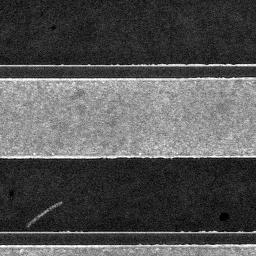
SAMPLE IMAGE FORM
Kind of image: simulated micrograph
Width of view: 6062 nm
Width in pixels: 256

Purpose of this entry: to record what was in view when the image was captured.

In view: lines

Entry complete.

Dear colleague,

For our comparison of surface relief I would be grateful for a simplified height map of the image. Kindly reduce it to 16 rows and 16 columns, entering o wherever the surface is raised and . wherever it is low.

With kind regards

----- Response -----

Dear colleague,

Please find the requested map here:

................
................
................
................
................
oooooooooooooooo
oooooooooooooooo
oooooooooooooooo
oooooooooooooooo
oooooooooooooooo
................
................
................
................
................
oooooooooooooooo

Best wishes